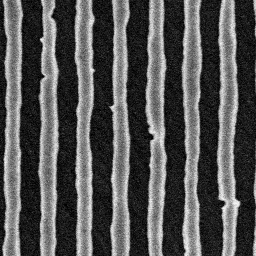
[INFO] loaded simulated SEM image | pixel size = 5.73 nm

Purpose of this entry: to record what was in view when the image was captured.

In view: parallel lines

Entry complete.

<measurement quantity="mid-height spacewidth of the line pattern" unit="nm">123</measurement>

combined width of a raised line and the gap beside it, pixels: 35.9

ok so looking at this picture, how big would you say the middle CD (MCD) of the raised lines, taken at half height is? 81.7 nm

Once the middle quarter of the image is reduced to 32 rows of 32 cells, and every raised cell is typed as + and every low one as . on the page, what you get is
....+++.....++++.....++++.....++
....+++.....++++.....++++.....++
....+++.....+++......++++.....++
....+++.....+++......++++.....++
....+++.....+++......++++.....++
....+++.....+++......++++.....++
....+++.....+++......++++.....++
....+++.....+++......++++.....++
....+++......++......++++.....++
....+++......++......++++.....++
....+++.....++++.....++++.....++
...++++.....++++.....++++.....++
...++++.....++++.....++++.....++
....+++.....++++.....++++.....++
....++.......+++.....++++......+
....++.......+++......+++......+
...+++.......+++......+++......+
...+++.......+++......+++......+
...+++.......+++.......++......+
...+++.......+++......+++.....++
...+++.......+++......+++......+
...++++......+++......+++......+
...++++......+++......+++......+
...++++.....++++......+++......+
...++++.....++++......+++......+
...++++.....++++.....++++......+
...++++.....++++......+++.....++
...++++.....++++......+++......+
...++++.....++++......+++.....++
...++++.....++++.....++++.....++
...++++.....++++.....++++.....++
...++++.....++++.....++++.....++